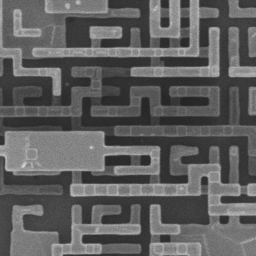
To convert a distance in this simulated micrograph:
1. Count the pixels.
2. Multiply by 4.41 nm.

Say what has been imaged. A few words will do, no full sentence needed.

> wiring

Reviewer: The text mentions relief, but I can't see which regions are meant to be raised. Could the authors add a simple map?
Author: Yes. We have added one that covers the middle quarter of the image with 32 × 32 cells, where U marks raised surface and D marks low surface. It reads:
DDDDDDDDDDDDDDDDDDDDDDDDDDDDDDDD
DDUUUUUUUDDDDDDDDUUUUUUUUUUUUUUU
DDUUUUUUUDDDDDDDDUUUUUUUUUUUUUUU
DDDDDDDUUDDDDDDDDDDDDDDDDDDDDDDD
DDDDDDDUUDDDDDDDDDDDDDDDDDDDDDDD
DDDDDDUUUDDDDDDDDDDDDDDDDDDDDDDD
DDUUUUUUUDDDDDDDDUUUUUUUDDUUUUUU
DDUUUUUUUDDDDDDDDUUUUUUUDDUUUUUU
DDUUUDDDDDDDDDDDDUUUDUUUDDDDDDDD
DDUUDDDDDDDDDDDDDUUDDUUUDDDDDDDD
DUUUDDDDDDDDDDDDUUUDDUUUUDDDDDDD
UUUUDDDUUUUUUUUUUUUDDDUUUUUUUUUU
UUUUDDDUUUUUUUUUUUUDDDUUUUUUUUUU
DDDDDDDDDDDDDDDDDDDDDDDDDDDDDDDD
DDDDDDDDDDDDDDDDDDDDDDDDDDDDDDDD
DDDDDDDDDDDDDUUUUUUUUUUUUUUUUUUU
DDDDDDDDDDDDDUUUUUUUUUUUUUUUUUUU
UUUUUUUUUUDDDUUUUUUUUUUUUUUUUUUU
UUUUUUUUUUDDDDDDDDDDDDDDDDDDDDDD
UUUUUUUUUUDDDDDDDDDDDDDDDDDDDDDD
UUUUUUUUUUUDDDDDDDDDDDDDDDDDDDDD
UUUUUUUUUUUUUUUUUUUUUUUUDDDDDDDD
UUUUUUUUUUUUUUUUUUUUUUUUDDDDDDDD
UUUUUUUUUUDDDDDDDDDDDDUUDDDDDDDD
UUUUUUUUUUDDDDDDDDDDDDUUDDDDDDDD
UUUUUUUUUUDDDUUUUUUUUUUUDDDDDDDU
UUDUUUUUUUDDDUUUUUUUUUUUDDDDDDDU
DDDDDDDDDDDDDUUUUUDDUUUDDDDDDDDU
DDDDDDDDDDDDDDDDDDDDDDDDDDDDDDDU
DDDDDDDDDDDDDDDDDDDDDDDDDDDDDDDU
DDUUUUUUUUUUUUUUUUUUUUUUUUUUUUUU
DDUUUUUUUUUUUUUUUUUUUUUUUUUUUUUU